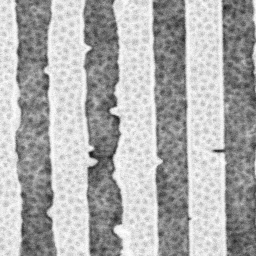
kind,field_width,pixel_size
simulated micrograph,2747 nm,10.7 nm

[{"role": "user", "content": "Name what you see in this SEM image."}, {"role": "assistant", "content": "one or a few lines or trenches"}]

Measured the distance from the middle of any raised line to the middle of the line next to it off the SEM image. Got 734 nm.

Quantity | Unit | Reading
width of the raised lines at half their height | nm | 353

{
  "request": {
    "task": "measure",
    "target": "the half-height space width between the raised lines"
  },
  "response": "380 nanometres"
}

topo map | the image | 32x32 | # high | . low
##.....###.....####....####.....
##.....###.....####....####.....
##.....###.....####.....####....
##....####.....####.....####....
##....####.....####.....####....
##....#####....####....#####....
##....#####....####....#####....
##....####.....####.....####....
##....####.....####.....####....
##....####.....####.....####....
##....#####....####.....####....
##....#####....####.....####....
##....####.....####.....####....
##.....###....#####.....####....
##.....###.....####.....####....
##.....####....####.....####....
##....#####....####.....####....
##.....####....####.....####....
##.....####....####.....####....
##.....####...######....####....
##.....#####..######....####....
##.....####....####.....####....
##.....####....####.....####....
##.....####....####.....####....
##.....####....####.....####....
##.....####....####.....####....
##....#####.....###.....####....
###....####....####.....####....
##.....####...#####.....####....
###....####.....###.....####....
##.....####.....####....####....
##.....####.....####....####....